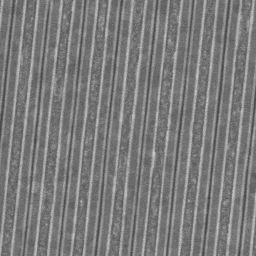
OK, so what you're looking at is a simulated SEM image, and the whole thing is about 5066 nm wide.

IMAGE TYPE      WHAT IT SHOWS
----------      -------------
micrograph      parallel lines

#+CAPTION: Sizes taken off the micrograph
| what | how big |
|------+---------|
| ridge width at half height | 0.192 microns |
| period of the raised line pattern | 354 nm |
